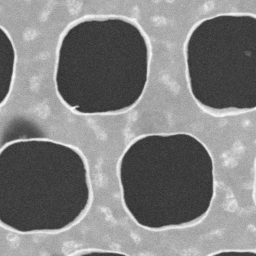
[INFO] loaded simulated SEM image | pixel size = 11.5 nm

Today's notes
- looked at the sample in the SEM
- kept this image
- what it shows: holes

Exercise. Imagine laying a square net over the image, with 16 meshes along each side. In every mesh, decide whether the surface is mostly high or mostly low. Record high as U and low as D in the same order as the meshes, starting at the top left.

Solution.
UUUUUUUUUUUUUUUU
UUUUUDDDUUUUUDDD
DUUUDDDDDUUUDDDD
DUUUDDDDDUUUDDDD
DUUUDDDDDUUUDDDD
DUUUDDDDDUUUDDDD
UUUUDDDDUUUUUDDD
UUUUUUUUUUUUUUUU
UUUUUUUUUDDDUUUU
DDDDDUUUDDDDDUUU
DDDDDUUUDDDDDUUU
DDDDDDUUDDDDDUUU
DDDDDDUUDDDDDUUU
DDDDDUUUDDDDDUUU
UUDUUUUUUUUUUUUU
UUUUUUUUUUUUUUUU